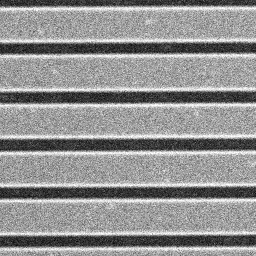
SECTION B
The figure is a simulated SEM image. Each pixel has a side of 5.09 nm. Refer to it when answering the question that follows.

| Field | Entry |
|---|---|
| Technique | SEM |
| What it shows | parallel lines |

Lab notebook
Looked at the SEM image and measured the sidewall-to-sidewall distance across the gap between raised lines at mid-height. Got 61.7 nm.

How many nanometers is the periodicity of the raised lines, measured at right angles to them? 245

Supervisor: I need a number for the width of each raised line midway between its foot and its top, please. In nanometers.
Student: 179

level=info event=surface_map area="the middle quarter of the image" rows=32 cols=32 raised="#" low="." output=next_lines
################################
################################
################################
################################
################################
################################
################################
................................
................................
................................
################################
################################
################################
################################
################################
################################
################################
################################
########.....######.............
................................
................................
................................
################################
################################
################################
################################
################################
################################
################################
################################
################################
................................